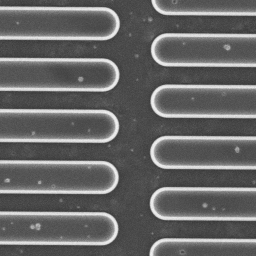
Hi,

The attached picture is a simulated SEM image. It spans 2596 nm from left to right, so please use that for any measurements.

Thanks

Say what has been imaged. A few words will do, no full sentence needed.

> groups of lines, slits or small figures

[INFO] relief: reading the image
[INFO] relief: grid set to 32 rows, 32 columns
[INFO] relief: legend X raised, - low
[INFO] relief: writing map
-------------------XXXXXXXXXXXXX
XXXXXXXXXXXXXX------XXXXXXXXXXXX
XXXXXXXXXXXXXXX-----------------
XXXXXXXXXXXXXXX-----------------
XXXXXXXXXXXXXX------XXXXXXXXXXXX
-------------------XXXXXXXXXXXXX
-------------------XXXXXXXXXXXXX
XXXXXXX-------------XXXXXXXXXXXX
XXXXXXXXXXXXXXX-----------------
XXXXXXXXXXXXXXX-----------------
XXXXXXXXXXXXXX------------------
-------------------XXXXXXXXXXXXX
-------------------XXXXXXXXXXXXX
-------------------XXXXXXXXXXXXX
XXXXXXXXXXXXXX-------XXXXXXXXXXX
XXXXXXXXXXXXXXX-----------------
XXXXXXXXXXXXXXX-----------------
XXXXXXXXXXXXX-------XXXXXXXXXXXX
-------------------XXXXXXXXXXXXX
-------------------XXXXXXXXXXXXX
XXXXXXXXXXXXXX------XXXXXXXXXXXX
XXXXXXXXXXXXXX------------------
XXXXXXXXXXXXXXX-----------------
XXXXXXXXXXXXXX------------------
-------------------XXXXXXXXXXXXX
-------------------XXXXXXXXXXXXX
-------------------XXXXXXXXXXXXX
XXXXXXXXXXXXXX------------------
XXXXXXXXXXXXXXX-----------------
XXXXXXXXXXXXXX------------------
--------------------XXXXXXXXXXXX
-------------------XXXXXXXXXXXXX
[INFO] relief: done